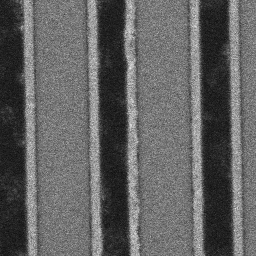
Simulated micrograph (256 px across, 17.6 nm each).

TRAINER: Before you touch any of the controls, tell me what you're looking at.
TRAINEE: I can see one or a few lines or trenches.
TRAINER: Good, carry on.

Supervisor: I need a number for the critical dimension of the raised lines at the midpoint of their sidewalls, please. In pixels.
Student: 40.5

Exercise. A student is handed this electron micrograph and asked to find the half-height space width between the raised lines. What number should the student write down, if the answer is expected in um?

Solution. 1.11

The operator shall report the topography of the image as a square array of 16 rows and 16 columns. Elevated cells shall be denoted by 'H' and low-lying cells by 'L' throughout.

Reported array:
HHLLLLHHLLLLHHHL
HHLLLLHHLLLLHHHL
HHLLLLHHLLLLHHHL
HHLLLLHHLLLLHHHL
HHLLLLHHLLLLHHHL
HHLLLLHHLLLLHHHL
HHLLLLHHLLLLHHHL
HHLLLLHHLLLLHHHL
HHLLLLHHLLLLHHHL
HHLLLLHHLLLLHHHL
HHLLLLHHLLLLHHHL
HHLLLLHHLLLLHHHL
HHLLLLHHLLLLHHHL
HHLLLLHHLLLLHHHL
HHLLLLHHLLLLHHHL
HHLLLLHHLLLLHHHL